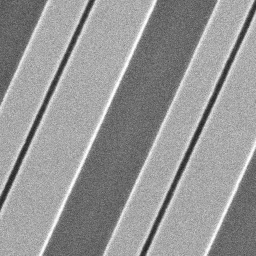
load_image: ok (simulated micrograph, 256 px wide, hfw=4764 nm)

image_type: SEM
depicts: lines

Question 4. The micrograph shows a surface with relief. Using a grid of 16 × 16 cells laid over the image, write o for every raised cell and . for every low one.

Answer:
...ooooooo...ooo
..ooooooo....ooo
..ooooooo....ooo
.ooooooo....oooo
.ooooooo....oooo
.oooooo....ooooo
ooooooo....ooooo
oooooo....oooooo
oooooo....oooooo
ooooo....ooooooo
ooooo....oooooo.
ooooo...ooooooo.
oooo....oooooo..
oooo....oooooo..
ooo....ooooooo..
ooo....oooooo...